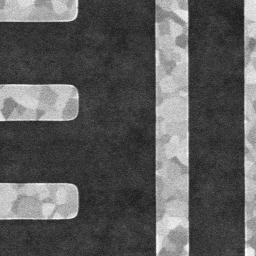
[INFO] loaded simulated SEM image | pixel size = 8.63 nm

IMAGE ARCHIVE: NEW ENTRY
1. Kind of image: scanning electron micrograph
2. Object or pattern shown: groups of lines, slits or small figures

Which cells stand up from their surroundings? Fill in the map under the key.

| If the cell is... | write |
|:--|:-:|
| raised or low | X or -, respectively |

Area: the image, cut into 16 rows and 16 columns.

XXXXX-----XX---X
----------XX---X
----------XX---X
----------XX---X
----------XX---X
XXXXX-----XX---X
XXXXX-----XX---X
X---------XX---X
----------XX---X
----------XX---X
----------XX---X
X--X------XX---X
XXXXX-----XX---X
XXXX------XX---X
----------XX---X
----------XX---X